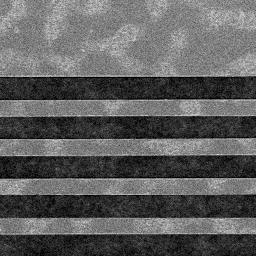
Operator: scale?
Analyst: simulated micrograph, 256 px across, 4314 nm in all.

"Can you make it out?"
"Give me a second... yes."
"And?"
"parallel lines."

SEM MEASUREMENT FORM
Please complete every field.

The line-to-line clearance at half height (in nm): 379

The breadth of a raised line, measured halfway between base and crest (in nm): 282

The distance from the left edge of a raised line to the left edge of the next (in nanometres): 664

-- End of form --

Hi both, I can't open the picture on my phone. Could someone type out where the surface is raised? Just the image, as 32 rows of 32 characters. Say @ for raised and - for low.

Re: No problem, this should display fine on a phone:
@@@@@@@@@@@@@@@@@@@@@@@@@@@@@@@@
@@@@@@@@@@@@@@@@@@@@@@@@@@@@@@@@
@@@@@@@@@@@@@@@@@@@@@@@@@@@@@@@@
@@@@@@@@@@@@@@@@@@@@@@@@@@@@@@@@
@@@@@@@@@@@@@@@@@@@@@@@@@@@@@@@@
@@@@@@@@@@@@@@@@@@@@@@@@@@@@@@@@
@@@@@@@@@@@@@@@@@@@@@@@@@@@@@@@@
@@@@@@@@@@@@@@@@@@@@@@@@@@@@@@@@
@@@@@@@@@@@@@@@@@@@@@@@@@@@@@@@@
@@@@@@@@@@@@@@@@@@@@@@@@@@@@@@@@
--------------------------------
--------------------------------
--------@@-@@@@-@@@@@@@@@@@@@@@@
@@@@@@@@@@@@@@@@@@@@@@@@@@@@@@@@
@@----------------------------@-
--------------------------------
--------------------------------
@@@@@@@@@@@@@@@@@@@@@@@@@@@@@@@@
@@@@@@@@@@@@@@@@@@@@@@@@@@@@@@@@
--------------------------------
--------------------------------
--------------------------------
@@@@@@@@@@@@@@@@@@@@@@@@@@@@@@@@
@@@@@@@@@@@@@@@@@@@@@@@@@@@@@@@@
--------------------------------
--------------------------------
--------------------------------
@@@@@@@@@@@@@@@@@@@@@@@@@@@@@@@@
@@@@@@@@@@@@@@@@@@@@@@@@@@@@@@@@
--------------------------------
--------------------------------
--------------------------------